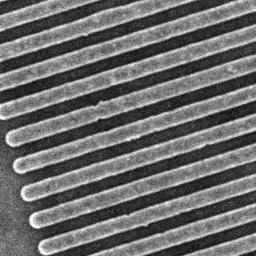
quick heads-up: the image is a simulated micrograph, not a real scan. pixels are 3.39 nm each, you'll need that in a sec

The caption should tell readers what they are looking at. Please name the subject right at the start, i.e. parallel lines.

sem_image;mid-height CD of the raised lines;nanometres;48.9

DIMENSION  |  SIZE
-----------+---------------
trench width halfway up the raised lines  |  0.0489 µm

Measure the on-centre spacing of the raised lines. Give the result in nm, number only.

96.4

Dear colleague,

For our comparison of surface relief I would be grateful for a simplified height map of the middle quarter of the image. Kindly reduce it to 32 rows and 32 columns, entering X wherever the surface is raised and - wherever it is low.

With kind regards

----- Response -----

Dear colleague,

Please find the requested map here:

XXXX-----------XXXXXXXXXXXXX----
X-----------XXXXXXXXXXXX--------
---------XXXXXXXXXXXX-----------
------XXXXXXXXXXXX------------XX
--XXXXXXXXXXXX------------XXXXXX
XXXXXXXXXXX------------XXXXXXXXX
XXXXXXXX------------XXXXXXXXXXXX
XXXXX-----------XXXXXXXXXXXXX---
XX------------XXXXXXXXXXXX------
-----------XXXXXXXXXXXX---------
--------XXXXXXXXXXX------------X
----XXXXXXXXXXXX------------XXXX
-XXXXXXXXXXXX------------XXXXXXX
XXXXXXXXX------------XXXXXXXXXXX
XXXXXXX-----------XXXXXXXXXXXX--
XXX-------------XXXXXXXXXXX-----
------------XXXXXXXXXXX---------
--------XXXXXXXXXXXX------------
------XXXXXXXXXXXX-----------XXX
---XXXXXXXXXXX------------XXXXXX
XXXXXXXXXXX------------XXXXXXXXX
XXXXXXXX------------XXXXXXXXXXXX
XXXX-------------XXXXXXXXXXXX---
X------------XXXXXXXXXXXX-------
----------XXXXXXXXXXXX----------
-------XXXXXXXXXXXX-----------XX
----XXXXXXXXXXXX-----------XXXXX
-XXXXXXXXXXXX-----------XXXXXXXX
XXXXXXXXX------------XXXXXXXXXXX
XXXXXX------------XXXXXXXXXXXX--
XXX-----------XXXXXXXXXXXXX-----
-----------XXXXXXXXXXXXX--------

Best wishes